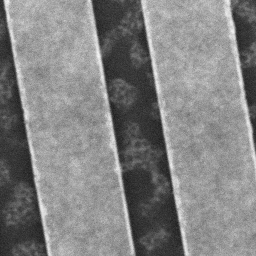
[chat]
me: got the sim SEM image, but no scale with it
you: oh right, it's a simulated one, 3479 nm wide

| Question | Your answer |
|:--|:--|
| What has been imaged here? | one or a few lines or trenches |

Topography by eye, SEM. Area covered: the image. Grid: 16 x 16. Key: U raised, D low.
UUUUUUDDDUUUUUDD
DUUUUUDDDUUUUUDD
DUUUUUDDDUUUUUUD
DUUUUUDDDDUUUUUD
DUUUUUDDDDUUUUUD
DUUUUUUDDDUUUUUD
DUUUUUUDDDUUUUUD
DDUUUUUDDDUUUUUD
DDUUUUUDDDUUUUUU
DDUUUUUDDDDUUUUU
DDUUUUUDDDDUUUUU
DDUUUUUUDDDUUUUU
DDDUUUUUDDDUUUUU
DDDUUUUUDDDUUUUU
DDDUUUUUDDDUUUUU
DDDUUUUUDDDDUUUU